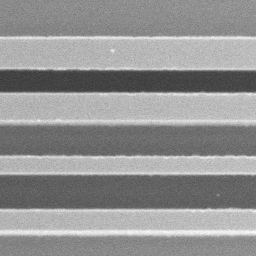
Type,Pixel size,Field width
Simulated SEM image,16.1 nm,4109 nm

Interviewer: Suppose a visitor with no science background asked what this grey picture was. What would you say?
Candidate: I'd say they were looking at lines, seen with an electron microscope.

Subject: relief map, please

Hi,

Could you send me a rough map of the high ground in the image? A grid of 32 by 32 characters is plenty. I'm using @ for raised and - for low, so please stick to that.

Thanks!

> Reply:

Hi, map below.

--------------------------------
--------------------------------
--------------------------------
--------------------------------
--------------------------------
@@@@@@@@@@@@@@@@@@@@@@@@@@@@@@@@
@@@@@@@@@@@@@@@@@@@@@@@@@@@@@@@@
@@@@@@@@@@@@@@@@@@@@@@@@@@@@@@@@
@@@@@@@@@@@@@@@@@@@@@@@@@@@@@@@@
--------------------------------
--------------------------------
--------------------------------
@@@@@@@@@@@@@@@@@@@@@@@@@@@@@@@@
@@@@@@@@@@@@@@@@@@@@@@@@@@@@@@@@
@@@@@@@@@@@@@@@@@@@@@@@@@@@@@@@@
--------------------------------
--------------------------------
--------------------------------
--------------------------------
---@----------------------------
@@@@@@@@@@@@@@@@@@@@@@@@@@@@@@@@
@@@@@@@@@@@@@@@@@@@@@@@@@@@@@@@@
--------------------------------
--------------------------------
--------------------------------
--------------------------------
@@@@@@@@@@@@@@@@@@@@@@@@@@@@@@@@
@@@@@@@@@@@@@@@@@@@@@@@@@@@@@@@@
@@@@@@@@@@@@@@@@@@@@@@@@@@@@@@@@
--------------------------------
--------------------------------
--------------------------------